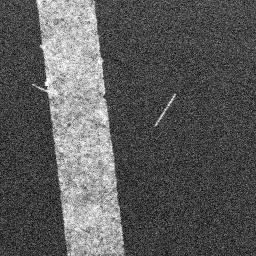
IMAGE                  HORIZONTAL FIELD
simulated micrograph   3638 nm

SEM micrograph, one or a few lines or trenches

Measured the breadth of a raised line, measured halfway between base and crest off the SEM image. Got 0.797 micrometres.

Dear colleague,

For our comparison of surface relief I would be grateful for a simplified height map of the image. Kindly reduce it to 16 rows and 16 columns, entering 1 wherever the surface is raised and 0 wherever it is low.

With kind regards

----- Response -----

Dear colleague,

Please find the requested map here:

0011110000000000
0001110000000000
0001110000000000
0001110000000000
0001110000000000
0001111000000000
0001111000000000
0001111000000000
0001111000000000
0001111000000000
0000111000000000
0000111000000000
0000111000000000
0000111000000000
0000111100000000
0000111100000000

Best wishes